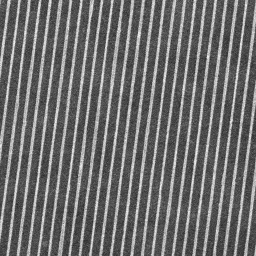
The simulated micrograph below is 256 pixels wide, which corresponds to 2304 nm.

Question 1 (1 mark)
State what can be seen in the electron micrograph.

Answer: parallel lines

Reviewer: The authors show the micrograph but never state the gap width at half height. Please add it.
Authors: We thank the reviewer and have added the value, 0.0714 microns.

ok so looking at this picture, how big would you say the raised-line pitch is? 92.3 nm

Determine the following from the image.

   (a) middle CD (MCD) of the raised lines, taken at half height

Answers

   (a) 18.9 nanometers